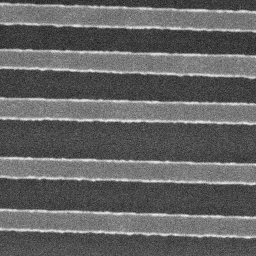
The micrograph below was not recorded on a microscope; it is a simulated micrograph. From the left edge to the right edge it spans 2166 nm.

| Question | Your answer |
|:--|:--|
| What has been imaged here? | lines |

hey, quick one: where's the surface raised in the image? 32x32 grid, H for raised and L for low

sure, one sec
HHHLLLLLLLLLLLLLLLLLLLLLLLLLLLLL
HHHHHHHHHHHHHHHHHHHHHHHHHHHHHHHH
HHHHHHHHHHHHHHHHHHHHHHHHHHHHHHHH
LLLLLLLLLLLLLLLHHHHHHHHHHHHHHHHH
LLLLLLLLLLLLLLLLLLLLLLLLLLLLLLLL
LLLLLLLLLLLLLLLLLLLLLLLLLLLLLLLL
HHHHHHHHHHHHHHHLLLLLLLLLLLLLLLLL
HHHHHHHHHHHHHHHHHHHHHHHHHHHHHHHH
HHHHHHHHHHHHHHHHHHHHHHHHHHHHHHHH
LLLLLLLLLLLLLLLLLLLLLLLLLLHHHHHH
LLLLLLLLLLLLLLLLLLLLLLLLLLLLLLLL
LLLLLLLLLLLLLLLLLLLLLLLLLLLLLLLL
HHHHHHHHHHHHHLLLLLLLLLLLLLLLLLLL
HHHHHHHHHHHHHHHHHHHHHHHHHHHHHHHH
HHHHHHHHHHHHHHHHHHHHHHHHHHHHHHHH
LLLLLLLLLLLLLLLLLLLLLLLLLLLLLLLH
LLLLLLLLLLLLLLLLLLLLLLLLLLLLLLLL
LLLLLLLLLLLLLLLLLLLLLLLLLLLLLLLL
LLLLLLLLLLLLLLLLLLLLLLLLLLLLLLLL
LLLLLLLLLLLLLLLLLLLLLLLLLLLLLLLL
HHHHHHHHHHHHHHHHHHHHHHHHHHHHHHLL
HHHHHHHHHHHHHHHHHHHHHHHHHHHHHHHH
LLLLLLLLLLLHLLHHHHHHHHHHHHHHHHHH
LLLLLLLLLLLLLLLLLLLLLLLLLLLLLLLL
LLLLLLLLLLLLLLLLLLLLLLLLLLLLLLLL
LLLLLLLLLLLLLLLLLLLLLLLLLLLLLLLL
HHHHHHHHHHHLLLLLLLLLLLLLLLLLLLLL
HHHHHHHHHHHHHHHHHHHHHHHHHHHHHHHH
HHHHHHHHHHHHHHHHHHHHHHHHHHHHHHHH
LLLLLLLLLLLLLLLLLLLLLLLLLHLHHHHH
LLLLLLLLLLLLLLLLLLLLLLLLLLLLLLLL
LLLLLLLLLLLLLLLLLLLLLLLLLLLLLLLL